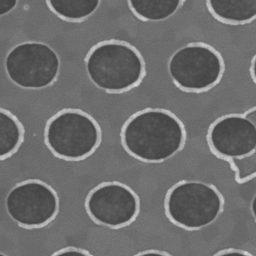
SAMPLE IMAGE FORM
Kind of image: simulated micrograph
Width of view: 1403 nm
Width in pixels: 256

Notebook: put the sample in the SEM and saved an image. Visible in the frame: a regular array of holes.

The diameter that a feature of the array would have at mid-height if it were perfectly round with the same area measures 257 nm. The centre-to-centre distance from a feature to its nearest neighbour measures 0.438 µm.